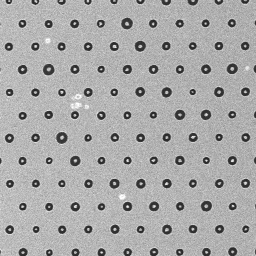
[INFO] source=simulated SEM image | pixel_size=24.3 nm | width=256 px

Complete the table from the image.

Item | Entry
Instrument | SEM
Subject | a regular array of ring-shaped grooves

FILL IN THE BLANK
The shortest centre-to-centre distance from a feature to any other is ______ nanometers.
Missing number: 629